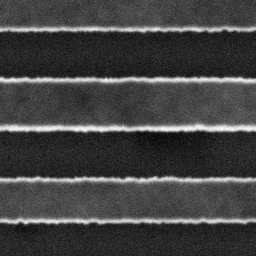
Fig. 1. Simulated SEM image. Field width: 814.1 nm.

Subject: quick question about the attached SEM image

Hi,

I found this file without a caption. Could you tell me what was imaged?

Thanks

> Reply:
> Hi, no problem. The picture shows lines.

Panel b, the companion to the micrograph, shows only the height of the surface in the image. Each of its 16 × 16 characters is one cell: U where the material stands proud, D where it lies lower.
UUUUUUUUUUUUUUUU
UUUUUUUUUUUUUUUU
DDDDDDDDDDDDDDDD
DDDDDDDDDDDDDDDD
DDDDDDDDDDDDDDDD
UUUUUUUUUUUUUUUU
UUUUUUUUUUUUUUUU
UUUUUUUUUUUUUUUU
DDDDDDDDDDDDDDDD
DDDDDDDDDDDDDDDD
DDDDDDDDDDDDDDDD
UUUUUUUUUUUUUUUU
UUUUUUUUUUUUUUUU
UUUUUUUUUUUUUUUU
DDDDDDDDDDDDDDDD
DDDDDDDDDDDDDDDD